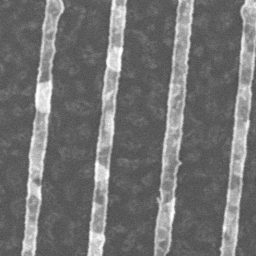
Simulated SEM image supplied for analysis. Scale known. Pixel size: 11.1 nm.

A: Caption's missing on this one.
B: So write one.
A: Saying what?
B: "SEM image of one or a few lines or trenches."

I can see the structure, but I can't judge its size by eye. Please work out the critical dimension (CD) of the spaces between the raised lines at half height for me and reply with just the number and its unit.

589 nm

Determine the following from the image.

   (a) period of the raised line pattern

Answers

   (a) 738 nanometers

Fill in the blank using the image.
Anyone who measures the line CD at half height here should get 0.145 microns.